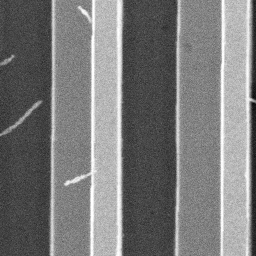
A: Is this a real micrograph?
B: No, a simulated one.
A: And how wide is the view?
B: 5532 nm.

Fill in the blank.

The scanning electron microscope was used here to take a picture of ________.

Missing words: lines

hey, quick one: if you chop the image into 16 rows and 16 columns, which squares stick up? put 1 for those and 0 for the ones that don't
0001111000011111
0001111000011111
0001111000011111
0001111000011111
0001111000011111
0001111000011111
0001111000011111
0001111000011111
0001111000011111
0001111000011111
0001111000011111
0001111000011111
0001111000011111
0001111000011111
0001111000011111
0001111000011111